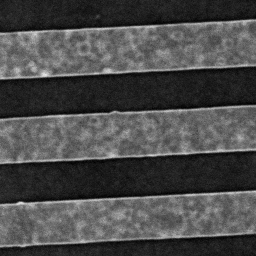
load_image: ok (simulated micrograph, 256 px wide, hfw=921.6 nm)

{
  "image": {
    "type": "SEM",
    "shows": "one or a few lines or trenches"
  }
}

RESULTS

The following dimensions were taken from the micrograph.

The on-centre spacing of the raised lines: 304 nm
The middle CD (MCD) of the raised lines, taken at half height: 156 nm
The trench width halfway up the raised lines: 40.4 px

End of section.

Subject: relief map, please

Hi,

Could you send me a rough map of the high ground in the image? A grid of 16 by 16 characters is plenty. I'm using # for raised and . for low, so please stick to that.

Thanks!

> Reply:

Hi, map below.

................
...........#####
################
################
########........
................
................
################
################
##############..
................
................
......##########
################
################
................